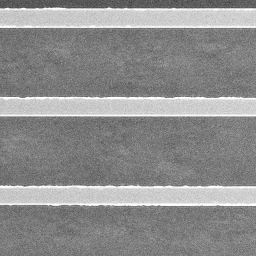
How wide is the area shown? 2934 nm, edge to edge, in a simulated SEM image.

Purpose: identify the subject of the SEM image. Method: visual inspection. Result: lines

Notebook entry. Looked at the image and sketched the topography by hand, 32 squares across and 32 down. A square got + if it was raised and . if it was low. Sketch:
................................
++++++++++++++++++++++++++++++++
++++++++++++++++++++++++++++++++
................................
................................
................................
................................
................................
................................
................................
................................
................................
++++++++++++++++++++++++++++++++
++++++++++++++++++++++++++++++++
................................
................................
................................
................................
................................
................................
................................
................................
................................
++++++++++++++++++++++++++++++++
++++++++++++++++++++++++++++++++
++++++++++++++++++++++++++++++++
................................
................................
................................
................................
................................
................................